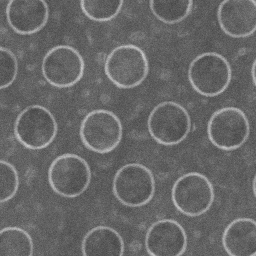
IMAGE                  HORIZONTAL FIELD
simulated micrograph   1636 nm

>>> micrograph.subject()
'a regular array of raised bodies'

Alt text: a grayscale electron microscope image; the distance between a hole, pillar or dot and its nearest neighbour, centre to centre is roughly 0.377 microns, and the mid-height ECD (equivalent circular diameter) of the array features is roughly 266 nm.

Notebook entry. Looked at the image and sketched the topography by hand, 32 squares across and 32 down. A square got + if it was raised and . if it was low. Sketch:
.+++++....+++++....+++++....++++
.+++++.....++++....+++++...+++++
.+++++..............+++....+++++
..+++.......................++++
.............................+..
................................
+.....++++....++++..............
++....++++...+++++......++++....
++...+++++...+++++......+++++...
++....++++....++++......+++++...
+......++......++.......++++....
.........................+++....
................................
...++..............++++.........
..+++++....+++.....+++++...++++.
..+++++...+++++....+++++..+++++.
..+++++...+++++....++++...+++++.
..+++++...+++++.....+++...+++++.
....+......+++..............+...
........++......................
+......++++.....................
++....+++++....++++.............
++....+++++...+++++...++++......
++.....++++...+++++...++++......
++......+......++++...+++++.....
................++....++++......
.......................++.......
....................+.........+.
............++.....++++.....++++
++++.......++++...+++++.....++++
++++......+++++...+++++.....++++
++++......+++++....++++......+++